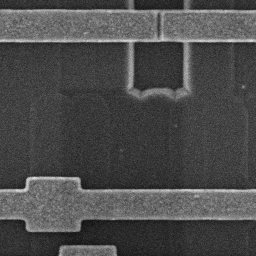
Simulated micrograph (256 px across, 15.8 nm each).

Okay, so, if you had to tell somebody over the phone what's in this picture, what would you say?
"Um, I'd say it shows wiring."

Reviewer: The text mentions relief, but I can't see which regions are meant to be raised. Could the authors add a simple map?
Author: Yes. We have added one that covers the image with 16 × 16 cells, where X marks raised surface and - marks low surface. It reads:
----------------
XXXXXXXXXXXXXXXX
XXXXXXXXX--XXXXX
----------------
----------------
----------------
----------------
----------------
----------------
----------------
----------------
--XXX-----------
XXXXXXXXXXXXXXXX
XXXXXXXXXXXXXXXX
----------------
----XXX---------